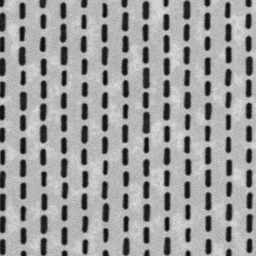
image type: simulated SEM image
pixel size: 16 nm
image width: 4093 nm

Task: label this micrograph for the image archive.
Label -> a regular array of holes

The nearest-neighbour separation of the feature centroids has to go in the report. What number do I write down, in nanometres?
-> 356